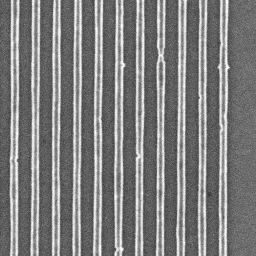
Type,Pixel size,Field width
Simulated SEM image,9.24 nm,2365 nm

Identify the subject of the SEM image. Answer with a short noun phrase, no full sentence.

parallel lines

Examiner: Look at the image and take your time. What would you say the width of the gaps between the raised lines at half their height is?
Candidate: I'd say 144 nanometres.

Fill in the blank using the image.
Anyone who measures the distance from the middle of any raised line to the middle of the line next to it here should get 193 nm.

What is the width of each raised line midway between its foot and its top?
53.1 nm